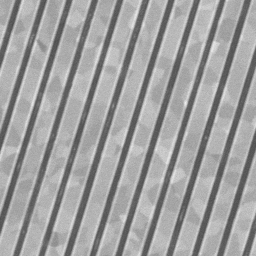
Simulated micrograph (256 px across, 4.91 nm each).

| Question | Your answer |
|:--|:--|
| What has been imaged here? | parallel lines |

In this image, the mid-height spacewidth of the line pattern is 37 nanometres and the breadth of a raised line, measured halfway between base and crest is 0.0828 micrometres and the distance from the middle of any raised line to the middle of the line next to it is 120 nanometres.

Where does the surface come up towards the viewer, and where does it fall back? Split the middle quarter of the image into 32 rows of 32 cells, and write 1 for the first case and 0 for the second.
11001111001111001111100111100111
10011111001111001111101111100111
10011110011111001111001111100111
10011110011110001111001111001111
00111110011110011111001111001111
00111100011110011110011111001111
00111100111100011110011110011111
01111100111100111110011110011110
01111100111100111100111110011110
01111001111100111100111100111110
11111001111001111100111100111100
11110001111001111001111100111100
11110011111001111001111001111100
11110011110011111001111001111101
11110011110011111011111001111001
11100111110011110011111001111001
11100111100011110011110011111001
11100111100111110011110011110011
11100111100111100111110011110011
11001111100111100111100111110011
11001111001111100111100111100111
10001111001111001111100111100111
10011111001111001111001111100111
10011110011111001111001111001111
00011110011110011111001111001111
00111110011110011110011111001111
00111100111110011110011111001111
00111100111110111110011110011111
01111100111100111110011110011110
01111000111100111100111110011110
01111001111100111100111100111110
01111001111001111100111100111100